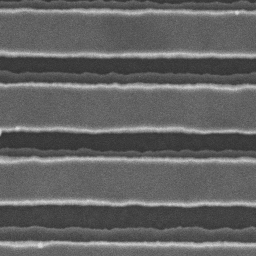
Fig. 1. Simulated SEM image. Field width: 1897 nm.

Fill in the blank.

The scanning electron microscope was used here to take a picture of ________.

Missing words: lines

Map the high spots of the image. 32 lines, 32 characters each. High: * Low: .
................................
********************************
********************************
********************************
********************************
********************************
********************************
................................
................................
................................
**********....*..*..............
********************************
********************************
********************************
********************************
********************************
.........*******.......*********
................................
................................
................................
********************************
********************************
********************************
********************************
********************************
****........********************
................................
................................
................................
................................
********************************
********************************